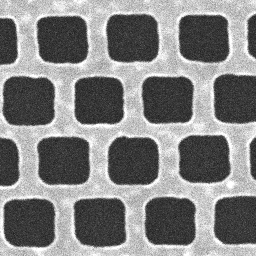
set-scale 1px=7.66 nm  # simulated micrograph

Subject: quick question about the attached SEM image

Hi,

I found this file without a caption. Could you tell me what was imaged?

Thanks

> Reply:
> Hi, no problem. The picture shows a regular array of holes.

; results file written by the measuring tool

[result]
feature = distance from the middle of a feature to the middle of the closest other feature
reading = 69.4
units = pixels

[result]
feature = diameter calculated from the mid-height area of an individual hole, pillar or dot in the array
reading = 421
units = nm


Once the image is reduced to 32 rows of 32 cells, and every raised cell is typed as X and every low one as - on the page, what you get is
XXXXXXXXXXXXXXXXXXXXXXXXXXXXXXXX
XXXXXXXXXXXXXXXXXXXXXXXXXXXXXXXX
--XXX------XXX------XX------XXX-
--XXX------XX-------XX-------XX-
--XXX------XX-------XX-------XX-
--XXX------XX-------XX-------XX-
--XXX------XX-------XX-------XX-
--XXX------XXX-----XXXX-----XXXX
XXXXXXXXXXXXXXXXXXXXXXXXXXXXXXXX
XX-XXXXXXXXXX-XXXXXXXX-XXXX-----
-------XX------XXX------XXX-----
-------XX-------XX------XXX-----
-------XX-------XX------XXX-----
-------XX-------XX------XXX-----
-------XX-------XX------XXX-----
X-----XXXX----XXXXX-XXXXXXXXXX-X
XXXXXXXXXXXXXXXXXXXXXXXXXXXXXXXX
-XXXX------XXX-----XXXX-----XXX-
--XXX------XXX------XX-------XX-
--XXX------XX-------XX-------XX-
--XXX------XX-------XX-------XX-
--XXX------XX-------XX-------XX-
--XXX------XXX-----XXXX-----XXXX
XXXXXXXXXXXXXXXXXXXXXXXXXXXXXXXX
XXXXXXXXXXXXXXXXXXXXXXXXXXXXXX--
X------XX-------XX------XXX-----
-------XX-------XX-------XX-----
-------XX-------XX------XXX-----
-------XX-------XX-------XX-----
X------XX-------XX------XXX-----
X-----XXXX-----XXXX-----XXXX--XX
XXXXXXXXXXXXXXXXXXXXXXXXXXXXXXXX